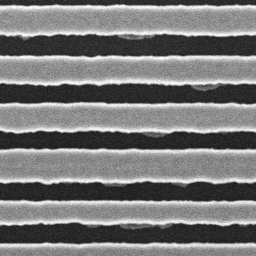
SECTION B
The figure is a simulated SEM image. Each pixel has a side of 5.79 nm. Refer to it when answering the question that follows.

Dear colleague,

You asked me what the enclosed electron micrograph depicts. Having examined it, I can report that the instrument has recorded lines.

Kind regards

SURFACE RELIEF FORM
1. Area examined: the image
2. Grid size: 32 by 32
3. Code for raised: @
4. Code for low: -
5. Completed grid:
--------------------------------
@@@@@@@@@@@@@@@@@@@@@@@@@@@@@@@@
@@@@@@@@@@@@@@@@@@@@@@@@@@@@@@@@
@@@@@@@@@@@@@@@@@@@@@@@@@@@@@@@@
-@-@@------------------@@-@@@@--
--------------------------------
--------------------------------
@@@@@@@@@@@@@@@@@@@@@@@@@@@@@@@@
@@@@@@@@@@@@@@@@@@@@@@@@@@@@@@@@
@@@@@@@@@@@@@@@@@@@@@@@@@@@@@@@@
-@@@@@@@@@@@@@@@--@@@@@@@@@--@-@
--------------------------------
--------------------------------
@@@@@@@@@@@@@@@@@@@@@@@@@@@@@@@@
@@@@@@@@@@@@@@@@@@@@@@@@@@@@@@@@
@@@@@@@@@@@@@@@@@@@@@@@@@@@@@@@@
-@@@@--@@@-----@@@@@@@-@@@@@---@
--------------------------------
--------------------------------
@@@@@@@@@@@@@@@@@@@@@@@@@@@@@@@@
@@@@@@@@@@@@@@@@@@@@@@@@@@@@@@@@
@@@@@@@@@@@@@@@@@@@@@@@@@@@@@@@@
@@@@@@@@@@@@@@@@@@@@@@@@@@@@@@@@
--------------------------------
--------------------------------
@@@@@@@@@@@@@@@@@@@@@@@@@@@@@@@@
@@@@@@@@@@@@@@@@@@@@@@@@@@@@@@@@
@@@@@@@@@@@@@@@@@@@@@@@@@@@@@@@@
--------------------------------
--------------------------------
-----@@@---@@@@@--@@@@-@@@@---@@
@@@@@@@@@@@@@@@@@@@@@@@@@@@@@@@@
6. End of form